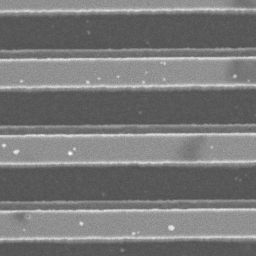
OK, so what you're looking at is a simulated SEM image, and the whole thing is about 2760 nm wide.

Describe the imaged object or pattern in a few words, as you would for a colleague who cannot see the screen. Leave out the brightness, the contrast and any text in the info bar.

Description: lines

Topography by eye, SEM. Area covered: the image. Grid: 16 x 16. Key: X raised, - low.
XXXXXXXXXXXXXXXX
----------------
----------------
XXXXXXXXXXXXXXXX
XXXXXXXXXXXXXXXX
XXXX------------
----------------
----------------
XXXXXXXXXXXXXXXX
XXXXXXXXXXXXXXXX
----------------
----------------
----------------
XXXXXXXXXXXXXXXX
XXXXXXXXXXXXXXXX
----------------